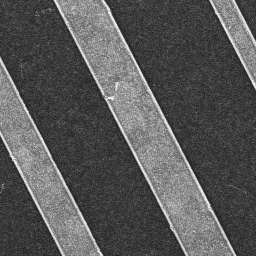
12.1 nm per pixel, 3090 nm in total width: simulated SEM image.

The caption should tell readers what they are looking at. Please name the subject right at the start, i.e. one or a few lines or trenches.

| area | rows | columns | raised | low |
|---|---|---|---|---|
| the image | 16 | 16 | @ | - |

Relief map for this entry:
----@@@------@@-
----@@@-------@-
-----@@@------@@
-----@@@-------@
------@@@------@
@-----@@@-------
@------@@@------
@@-----@@@------
@@------@@@-----
-@@-----@@@-----
-@@------@@@----
--@@-----@@@----
--@@@-----@@@---
---@@-----@@@---
---@@@-----@@@--
----@@-----@@@--